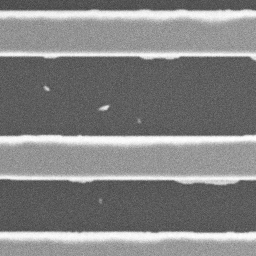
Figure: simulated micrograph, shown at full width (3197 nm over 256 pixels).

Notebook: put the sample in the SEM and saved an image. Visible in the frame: lines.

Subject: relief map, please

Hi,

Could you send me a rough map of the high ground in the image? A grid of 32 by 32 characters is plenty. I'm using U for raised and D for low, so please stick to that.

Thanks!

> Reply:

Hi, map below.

DDDDDDDDDDDDDDDDDDDDDDDDDDDDDDDD
DDDDDDDDDDDUUDDDDUUDDDUUDDDDDDUU
UUUUUUUUUUUUUUUUUUUUUUUUUUUUUUUU
UUUUUUUUUUUUUUUUUUUUUUUUUUUUUUUU
UUUUUUUUUUUUUUUUUUUUUUUUUUUUUUUU
UUUUUUUUUUUUUUUUUUUUUUUUUUUUUUUU
UUUUUUUUUUUUUUUUUUUUUUUUUUUUUUUU
DDDDDDDDDDDDDDDDDDDDDDDDDDDDDDDD
DDDDDDDDDDDDDDDDDDDDDDDDDDDDDDDD
DDDDDDDDDDDDDDDDDDDDDDDDDDDDDDDD
DDDDDDDDDDDDDDDDDDDDDDDDDDDDDDDD
DDDDDDDDDDDDDDDDDDDDDDDDDDDDDDDD
DDDDDDDDDDDDDDDDDDDDDDDDDDDDDDDD
DDDDDDDDDDDDDDDDDDDDDDDDDDDDDDDD
DDDDDDDDDDDDDDDDDDDDDDDDDDDDDDDD
DDDDDDDDDDDDDDDDDDDDDDDDDDDDDDDD
DDDDDDDDDDDDDDDDDDDDDDDDDDDDDDDD
UUUUUUUUUUUUUUUUUUUUUUUUUUUUUUUU
UUUUUUUUUUUUUUUUUUUUUUUUUUUUUUUU
UUUUUUUUUUUUUUUUUUUUUUUUUUUUUUUU
UUUUUUUUUUUUUUUUUUUUUUUUUUUUUUUU
UUUUUUUUUUUUUUUUUUUUUUUUUUUUUUUU
DDDDDDDDDDDDDDDDDDDDDDDDDDDDDDDD
DDDDDDDDDDDDDDDDDDDDDDDDDDDDDDDD
DDDDDDDDDDDDDDDDDDDDDDDDDDDDDDDD
DDDDDDDDDDDDDDDDDDDDDDDDDDDDDDDD
DDDDDDDDDDDDDDDDDDDDDDDDDDDDDDDD
DDDDDDDDDDDDDDDDDDDDDDDDDDDDDDDD
DDDDDDDDDDDDDDDDDDDDDDDDDDDDDDDD
UUUUUUUUUUUUUUUUUUUUUUUUUUUUUUUU
UUUUUUUUUUUUUUUUUUUUUUUUUUUUUUUU
UUUUUUUUUUUUUUUUUUUUUUUUUUUUUUUU